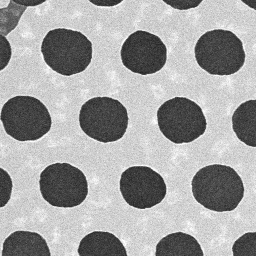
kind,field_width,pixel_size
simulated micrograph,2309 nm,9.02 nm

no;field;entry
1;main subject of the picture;a regular array of holes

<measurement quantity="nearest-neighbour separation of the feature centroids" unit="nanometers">691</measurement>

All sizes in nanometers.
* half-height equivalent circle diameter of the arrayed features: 433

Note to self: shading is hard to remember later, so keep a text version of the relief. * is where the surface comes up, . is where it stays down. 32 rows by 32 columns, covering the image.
*....*******...******....******.
...*****************************
..******************************
..******************************
.*****.....*****....*****.....**
.****......****......****.....**
.****.......***......***.......*
.*****.....****......****......*
******.....*****....*****.....**
********************************
********************************
********************************
*....******....******...*******.
......****......****.....*****..
......****......****......***...
......****......****......***...
*.....****......****......***...
**..********...******...******..
********************************
********************************
*******..***********************
.****.....*****.....*****.....**
.****......****......***......**
.****......****......***.......*
.****......****......***......**
.*****....******....*****.....**
********************************
********************************
********************************
*....******...*******...******..
......****.....*****.....****...
......****......***......****...